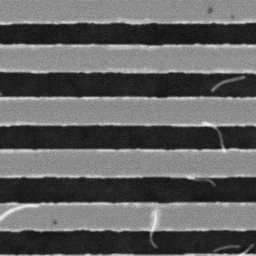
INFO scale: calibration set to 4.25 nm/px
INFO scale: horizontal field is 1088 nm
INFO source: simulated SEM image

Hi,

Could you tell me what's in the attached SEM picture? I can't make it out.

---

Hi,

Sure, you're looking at lines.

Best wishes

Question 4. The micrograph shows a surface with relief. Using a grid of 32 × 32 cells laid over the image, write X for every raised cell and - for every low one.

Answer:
XXXXXXXXXXXXXXXXXXXXXXXXXXXXXXXX
XXXXXXXXXXXXXXXXXXXXXXXXXXXXXXXX
XXXXXXXXXXXXXXXXXXXXXXXXXXXXXXXX
--------------------------------
--------------------------------
--------------------------------
XXXXXXXXXXXXXXXXXXXXXXXXXXXXXXXX
XXXXXXXXXXXXXXXXXXXXXXXXXXXXXXXX
XXXXXXXXXXXXXXXXXXXXXXXXXXXXXXXX
--------------------------------
--------------------------------
--------------------------------
XXXXXXXXXXXXXXXXXXXXXXXXXXXXXXXX
XXXXXXXXXXXXXXXXXXXXXXXXXXXXXXXX
XXXXXXXXXXXXXXXXXXXXXXXXXXXXXXXX
XXXXXXXXXXXXXXXXXXXXXXXXXXXXXXXX
--------------------------------
--------------------------------
--------------------------------
XXXXXXXXXXXXXXXXXXXXXXXXXXXXXXXX
XXXXXXXXXXXXXXXXXXXXXXXXXXXXXXXX
XXXXXXXXXXXXXXXXXXXXXXXXXXXXXXXX
--------------------------------
--------------------------------
--------------------------------
-XX--XXXXXXXXXXXXXXX-XXXXXXXXXXX
XXXXXXXXXXXXXXXXXXXXXXXXXXXXXXXX
XXXXXXXXXXXXXXXXXXXXXXXXXXXXXXXX
XXXXXXXXXXXXXXXXXXXXXXXXXXXXXXXX
--------------------------------
--------------------------------
--------------------------------